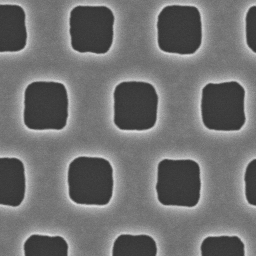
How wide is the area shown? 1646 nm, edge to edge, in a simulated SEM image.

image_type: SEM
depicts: holes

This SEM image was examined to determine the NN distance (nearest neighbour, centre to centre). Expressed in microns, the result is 0.564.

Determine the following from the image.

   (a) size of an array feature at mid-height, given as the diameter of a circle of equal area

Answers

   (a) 0.323 µm